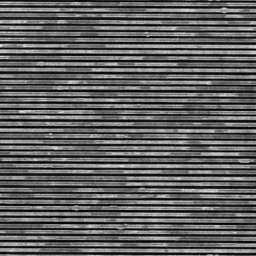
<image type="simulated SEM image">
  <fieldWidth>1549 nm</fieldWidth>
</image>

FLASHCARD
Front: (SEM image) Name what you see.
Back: parallel lines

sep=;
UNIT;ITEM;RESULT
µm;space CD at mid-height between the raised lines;0.0151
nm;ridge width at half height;19.7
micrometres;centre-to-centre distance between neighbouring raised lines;0.0364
